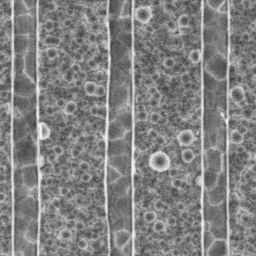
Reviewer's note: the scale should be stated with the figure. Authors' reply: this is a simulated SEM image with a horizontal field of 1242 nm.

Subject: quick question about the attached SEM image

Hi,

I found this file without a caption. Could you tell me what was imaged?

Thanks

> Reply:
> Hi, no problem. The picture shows one or a few lines or trenches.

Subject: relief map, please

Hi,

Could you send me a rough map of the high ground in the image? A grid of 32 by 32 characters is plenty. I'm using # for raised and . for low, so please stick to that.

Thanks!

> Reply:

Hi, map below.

##...#########...########....###
##...########....########....###
##...#########...########....###
##...#########...########....###
##...#########...########....###
##...#########...########....###
##...#########...########....###
##...#########...########....###
##...#########...########...####
##...#########...########...####
##...#########...########...####
##...#########...########...####
##...########....########...####
##...########....########...####
#....########....########...####
#....########....########...####
#....########....########...####
#....########....########...####
#....########....########...####
#....########....########...####
##...########....########...####
##...########....########...####
##...########....########...####
##...########....########...####
##...########....########...####
##...########....########...####
##...########....########...####
##...########....########....###
##...#########...########....###
##...#########...########....###
##...#########...########....###
##...#########...########....###